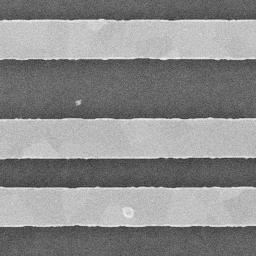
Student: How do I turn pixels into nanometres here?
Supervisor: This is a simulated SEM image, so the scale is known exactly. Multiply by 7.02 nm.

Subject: lines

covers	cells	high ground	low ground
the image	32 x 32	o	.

................................
................................
............o...................
oooooooooooooooooooooooooooooooo
oooooooooooooooooooooooooooooooo
oooooooooooooooooooooooooooooooo
oooooooooooooooooooooooooooooooo
................................
................................
................................
................................
................................
................................
................................
................................
oooooooooooooooooooooooooooooooo
oooooooooooooooooooooooooooooooo
oooooooooooooooooooooooooooooooo
oooooooooooooooooooooooooooooooo
oooooooooooooooooooooooooooooooo
................................
................................
................................
o...........o...ooooo....ooo.ooo
oooooooooooooooooooooooooooooooo
oooooooooooooooooooooooooooooooo
oooooooooooooooooooooooooooooooo
oooooooooooooooooooooooooooooooo
................................
................................
................................
................................